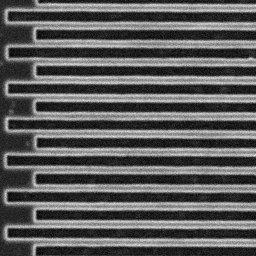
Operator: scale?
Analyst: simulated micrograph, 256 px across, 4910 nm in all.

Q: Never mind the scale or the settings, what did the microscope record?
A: parallel lines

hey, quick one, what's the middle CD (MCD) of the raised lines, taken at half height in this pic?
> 129 nm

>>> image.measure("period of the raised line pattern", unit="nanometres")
346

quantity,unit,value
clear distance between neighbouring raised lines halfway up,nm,228